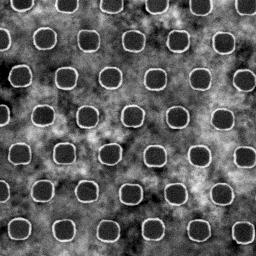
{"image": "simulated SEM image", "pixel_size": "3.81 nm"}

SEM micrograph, a regular array of raised bodies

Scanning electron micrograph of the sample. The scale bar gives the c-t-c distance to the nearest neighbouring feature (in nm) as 166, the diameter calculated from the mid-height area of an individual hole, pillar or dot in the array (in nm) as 87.